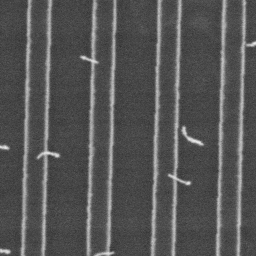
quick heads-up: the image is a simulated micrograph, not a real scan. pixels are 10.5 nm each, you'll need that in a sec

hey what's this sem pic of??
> lines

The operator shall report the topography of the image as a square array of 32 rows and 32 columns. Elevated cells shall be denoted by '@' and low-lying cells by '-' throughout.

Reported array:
----@@------@@------@@@-----@@@-
----@@------@@------@@------@@@-
----@@------@@------@@------@@--
----@@------@@------@@------@@--
----@@------@@------@@------@@--
----@@------@@------@@------@@--
----@@------@@------@@------@@--
---@@@------@@------@@------@@--
---@@@------@@------@@------@@--
---@@@------@@------@@------@@--
---@@@------@@------@@------@@--
---@@@------@@------@@------@@--
---@@@------@@------@@------@@--
---@@@-----@@@------@@------@@--
---@@@-----@@@------@@------@@--
---@@@-----@@@-----@@@------@@--
---@@@-----@@@-----@@@------@@--
---@@@-----@@@-----@@@-----@@@--
---@@@-----@@@-----@@@-----@@@--
---@@@-----@@@-----@@@-----@@@--
---@@@-----@@@-----@@@-----@@@--
---@@@-----@@@-----@@@-----@@@--
---@@@-----@@@-----@@@-----@@@--
---@@@-----@@@-----@@@-----@@@--
---@@@-----@@@-----@@@-----@@@--
---@@@-----@@@-----@@@-----@@@--
---@@@-----@@@-----@@@-----@@@--
---@@@-----@@@-----@@@-----@@@--
---@@------@@@-----@@@-----@@@--
---@@------@@@-----@@@-----@@@--
---@@------@@@-----@@@-----@@@--
---@@------@@@-----@@@-----@@@--